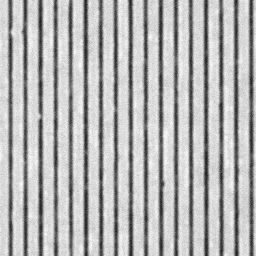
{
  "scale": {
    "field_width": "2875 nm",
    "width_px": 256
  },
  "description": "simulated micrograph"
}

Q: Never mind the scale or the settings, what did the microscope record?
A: parallel lines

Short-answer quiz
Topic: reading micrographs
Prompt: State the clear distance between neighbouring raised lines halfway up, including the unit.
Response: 5.5 pixels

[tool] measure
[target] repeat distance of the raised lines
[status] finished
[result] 169 nm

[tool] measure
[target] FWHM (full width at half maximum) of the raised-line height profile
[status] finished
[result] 101 nanometers